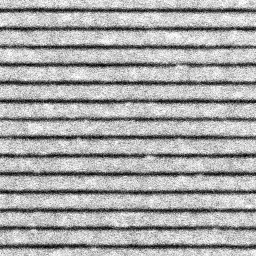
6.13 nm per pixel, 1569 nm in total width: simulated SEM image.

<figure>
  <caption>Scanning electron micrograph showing parallel lines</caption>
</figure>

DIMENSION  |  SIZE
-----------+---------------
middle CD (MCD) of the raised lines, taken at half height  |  85.9 nanometers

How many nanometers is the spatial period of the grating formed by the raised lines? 111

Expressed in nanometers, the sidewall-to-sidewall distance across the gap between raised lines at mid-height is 26.8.